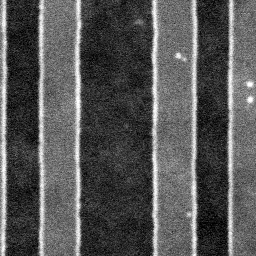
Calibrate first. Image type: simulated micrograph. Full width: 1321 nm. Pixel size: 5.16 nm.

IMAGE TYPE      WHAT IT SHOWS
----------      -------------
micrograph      lines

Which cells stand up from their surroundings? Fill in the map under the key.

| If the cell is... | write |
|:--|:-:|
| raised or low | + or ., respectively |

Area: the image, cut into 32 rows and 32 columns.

+....+++++.........+++++.....+++
+....+++++.........+++++.....+++
+....+++++.........+++++.....+++
+....+++++.........+++++.....+++
+....+++++.........+++++.....+++
+....+++++.........+++++.....+++
+....+++++.........+++++.....+++
+....+++++.........+++++.....+++
+....+++++.........+++++.....+++
+....+++++.........+++++.....+++
+....+++++.........+++++.....+++
+....+++++.........+++++.....+++
+....+++++.........+++++.....+++
+....+++++.........+++++.....+++
+....+++++.........+++++.....+++
+....+++++.........+++++.....+++
+....+++++.........+++++.....+++
+....+++++.........+++++.....+++
+....+++++.........+++++.....+++
+....+++++.........+++++.....+++
+....+++++.........+++++.....+++
+....+++++.........+++++.....+++
+....+++++.........+++++.....+++
+....+++++.........+++++.....+++
+....+++++.........+++++.....+++
+....+++++.........+++++.....+++
+....+++++.........+++++.....+++
+....+++++.........+++++.....+++
.....+++++.........+++++.....+++
.....+++++.........+++++.....+++
.....+++++.........+++++.....+++
.....+++++.........+++++.....+++